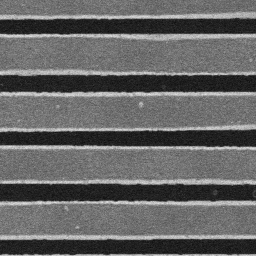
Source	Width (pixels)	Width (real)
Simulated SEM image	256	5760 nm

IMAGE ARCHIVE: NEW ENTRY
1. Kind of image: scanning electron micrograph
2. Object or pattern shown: lines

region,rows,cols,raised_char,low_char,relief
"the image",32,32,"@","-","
@@@@@@@@@@@@@@@@@@@@@@@@@@@@@@@@
@@@@@@@@@@@@@@@@@@@@@@@@@@@@@@@@
--------------------------------
--------------------------------
--------------------------------
@@@@@@@@@@@@@@@@@@@@@@@@@@@@@@@@
@@@@@@@@@@@@@@@@@@@@@@@@@@@@@@@@
@@@@@@@@@@@@@@@@@@@@@@@@@@@@@@@@
@@@@@@@@@@@@@@@@@@@@@@@@@@@@@@@@
--------------------------------
--------------------------------
--------------------------------
@@@@@@@@@@@@@@@@@@@@@@@@@@@@@@@@
@@@@@@@@@@@@@@@@@@@@@@@@@@@@@@@@
@@@@@@@@@@@@@@@@@@@@@@@@@@@@@@@@
@@@@@@@@@@@@@@@@@@@@@@@@@@@@@@@@
--------------------------------
--------------------------------
@@@@@@@@@@@@@@@-@@@@@@@---------
@@@@@@@@@@@@@@@@@@@@@@@@@@@@@@@@
@@@@@@@@@@@@@@@@@@@@@@@@@@@@@@@@
@@@@@@@@@@@@@@@@@@@@@@@@@@@@@@@@
@@@@@@@@@@@@@@@@@@@@@@@@@@@@@@@@
--------------------------------
--------------------------------
@@@@@@@@@@@@@@@@@@@@@@@@@@@@@@@@
@@@@@@@@@@@@@@@@@@@@@@@@@@@@@@@@
@@@@@@@@@@@@@@@@@@@@@@@@@@@@@@@@
@@@@@@@@@@@@@@@@@@@@@@@@@@@@@@@@
@@@@@@@@@@@@@@@@@@@@@@@@@@@@@@@@
--------------------------------
--------------------------------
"